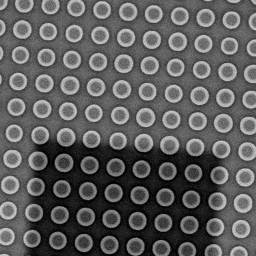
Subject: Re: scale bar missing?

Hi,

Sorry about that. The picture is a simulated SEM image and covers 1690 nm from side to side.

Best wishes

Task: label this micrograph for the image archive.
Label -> an array of small figures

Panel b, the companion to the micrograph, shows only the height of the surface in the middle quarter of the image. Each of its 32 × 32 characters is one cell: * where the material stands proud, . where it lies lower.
.***...***...****..*****..****..
........*....****...***...****..
...........................**...
***.............................
****..****...***................
****..****..****...****...**....
***...****..*****..****...***...
.*.....**....***...****..*****..
...................***....***...
...........................*....
***...***.......................
***...***...****...***..........
***..*****..****..*****..****...
**....***...****..*****..****..*
.............***..****...****..*
....................*....***....
**..............................
***..****...***.................
***..****...***...****...***....
***..****...****..****..*****..*
*.....**....***...****..*****..*
..................***...****...*
..........................*....*
**...***........................
**..****...****...**............
**..*****..****..****...****...*
*....***...****..****...****..**
...........***....***...****..**
.........................**....*
*...............................
*...****...***..................
**..****..*****..****...***.....